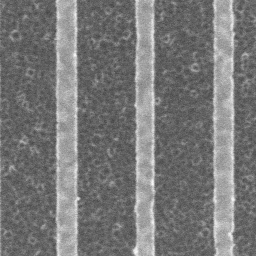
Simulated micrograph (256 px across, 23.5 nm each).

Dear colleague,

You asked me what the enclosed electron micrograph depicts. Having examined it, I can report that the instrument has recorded one or a few lines or trenches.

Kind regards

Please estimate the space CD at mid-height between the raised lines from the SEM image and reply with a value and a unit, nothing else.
1420 nm